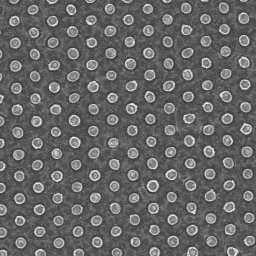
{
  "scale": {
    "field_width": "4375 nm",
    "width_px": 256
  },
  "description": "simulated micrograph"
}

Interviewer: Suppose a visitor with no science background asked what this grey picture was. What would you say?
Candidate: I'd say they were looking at a regular array of raised bodies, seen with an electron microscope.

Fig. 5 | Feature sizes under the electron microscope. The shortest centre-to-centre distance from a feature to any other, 369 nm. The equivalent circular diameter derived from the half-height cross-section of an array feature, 0.172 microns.